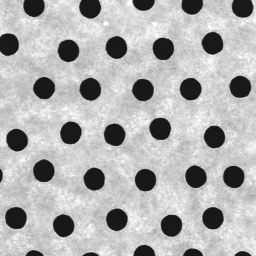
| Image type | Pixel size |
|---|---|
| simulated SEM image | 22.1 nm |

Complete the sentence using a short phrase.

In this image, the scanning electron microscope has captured a regular array of holes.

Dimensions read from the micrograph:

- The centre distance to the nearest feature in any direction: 979 nanometres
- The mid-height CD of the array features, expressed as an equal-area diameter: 489 nanometers